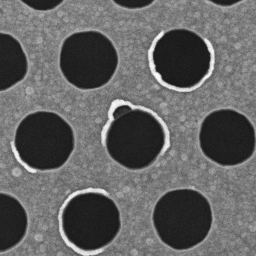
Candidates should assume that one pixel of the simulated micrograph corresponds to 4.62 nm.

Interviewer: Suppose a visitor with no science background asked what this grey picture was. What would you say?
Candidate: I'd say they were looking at holes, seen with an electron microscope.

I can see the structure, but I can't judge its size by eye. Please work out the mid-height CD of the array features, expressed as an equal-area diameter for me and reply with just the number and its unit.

271 nm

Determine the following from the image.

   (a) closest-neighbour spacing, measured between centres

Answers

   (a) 0.421 micrometres